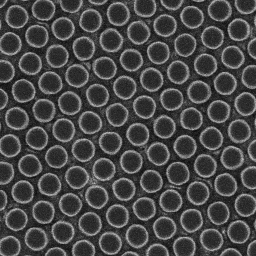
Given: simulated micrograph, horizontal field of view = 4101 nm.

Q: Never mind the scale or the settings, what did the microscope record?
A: a regular array of raised bodies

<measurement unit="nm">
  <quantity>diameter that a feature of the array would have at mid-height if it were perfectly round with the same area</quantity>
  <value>350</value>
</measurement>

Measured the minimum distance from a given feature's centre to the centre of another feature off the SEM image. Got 441 nanometres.